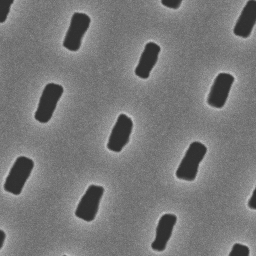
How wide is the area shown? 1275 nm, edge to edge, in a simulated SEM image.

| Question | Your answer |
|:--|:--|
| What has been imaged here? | a regular array of holes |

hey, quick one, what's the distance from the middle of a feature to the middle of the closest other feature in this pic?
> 381 nm